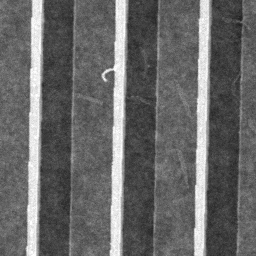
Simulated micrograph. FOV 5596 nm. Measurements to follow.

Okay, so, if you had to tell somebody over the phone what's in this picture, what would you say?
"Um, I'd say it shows lines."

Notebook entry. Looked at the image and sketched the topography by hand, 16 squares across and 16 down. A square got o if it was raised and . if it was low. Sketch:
ooo..ooo..ooo..o
ooo..ooo..ooo..o
ooo..ooo..ooo..o
ooo..ooo..ooo..o
ooo..ooo..ooo..o
ooo..ooo..ooo..o
ooo..ooo..ooo..o
oo...ooo..ooo..o
oo...ooo..ooo..o
oo...ooo..ooo..o
oo..oooo..ooo..o
oo..oooo..ooo..o
oo..oooo..ooo..o
oo..oooo..ooo..o
oo..oooo..ooo..o
oo..oooo..ooo..o